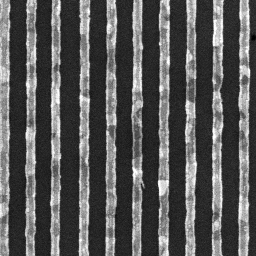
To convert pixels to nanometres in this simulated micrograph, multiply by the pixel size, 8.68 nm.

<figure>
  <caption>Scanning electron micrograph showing parallel lines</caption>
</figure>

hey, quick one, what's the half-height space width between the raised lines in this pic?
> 18.6 pixels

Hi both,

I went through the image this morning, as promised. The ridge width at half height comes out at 0.0695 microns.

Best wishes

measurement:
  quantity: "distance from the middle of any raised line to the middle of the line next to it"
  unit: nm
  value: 231